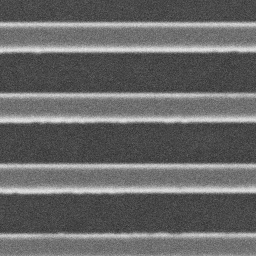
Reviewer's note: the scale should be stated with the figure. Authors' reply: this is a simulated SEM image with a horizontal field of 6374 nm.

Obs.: lines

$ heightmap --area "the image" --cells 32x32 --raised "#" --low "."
................................
................................
................................
################################
################################
################################
................................
................................
................................
................................
................................
................................
################################
################################
################################
................................
................................
................................
................................
................................
................................
################################
################################
################################
................................
................................
................................
................................
................................
################################
################################
################################